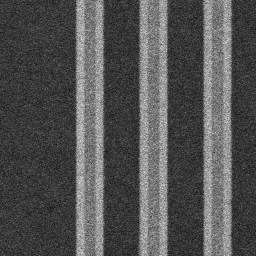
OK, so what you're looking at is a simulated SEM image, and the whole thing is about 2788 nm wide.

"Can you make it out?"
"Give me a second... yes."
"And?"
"one or a few lines or trenches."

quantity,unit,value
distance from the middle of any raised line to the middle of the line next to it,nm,694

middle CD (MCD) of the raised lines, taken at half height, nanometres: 214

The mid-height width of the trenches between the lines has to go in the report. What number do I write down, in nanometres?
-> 476